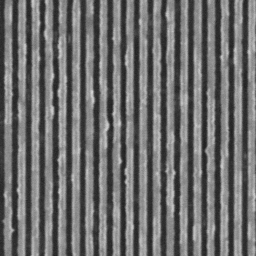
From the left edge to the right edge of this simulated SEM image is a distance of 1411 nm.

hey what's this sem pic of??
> parallel lines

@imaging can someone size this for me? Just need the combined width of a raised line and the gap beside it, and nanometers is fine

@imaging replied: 74.5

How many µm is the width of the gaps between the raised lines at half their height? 0.0379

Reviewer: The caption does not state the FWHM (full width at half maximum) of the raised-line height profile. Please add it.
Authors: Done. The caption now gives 37.9 nanometers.